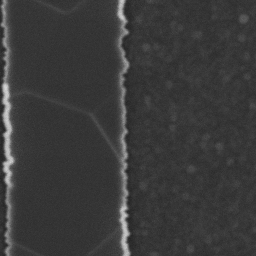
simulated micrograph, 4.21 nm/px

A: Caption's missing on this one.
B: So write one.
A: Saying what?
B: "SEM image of one or a few lines or trenches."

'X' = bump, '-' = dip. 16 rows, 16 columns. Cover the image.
XXXXXXXX--------
XXXXXXXX--------
XXXXXXXX--------
XXXXXXXX--------
XXXXXXXX--------
XXXXXXXX--------
XXXXXXXX--------
XXXXXXXX--------
XXXXXXXX--------
XXXXXXXX--------
XXXXXXXX--------
XXXXXXXX--------
XXXXXXXX--------
XXXXXXXX--------
XXXXXXXX--------
XXXXXXXX--------